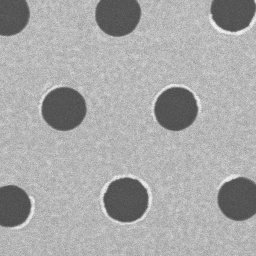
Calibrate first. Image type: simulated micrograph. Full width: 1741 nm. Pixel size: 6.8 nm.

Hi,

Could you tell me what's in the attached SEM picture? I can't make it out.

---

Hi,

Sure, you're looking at holes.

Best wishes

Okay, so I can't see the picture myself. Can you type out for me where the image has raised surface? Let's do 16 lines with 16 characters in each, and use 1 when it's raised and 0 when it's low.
0011110001111000
0011110001111100
1111111111111111
1111111111111111
1111111111111111
1111111111111111
1110011111001111
1110011111001111
1111111111111111
1111111111111111
1111111111111111
1111111001111100
0011110001111100
0011111001111100
1111111111111111
1111111111111111